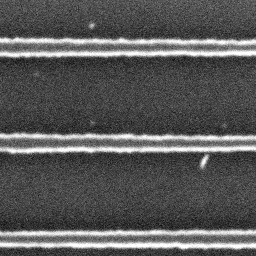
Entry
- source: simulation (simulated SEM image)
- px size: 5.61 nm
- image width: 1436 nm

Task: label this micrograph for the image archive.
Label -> lines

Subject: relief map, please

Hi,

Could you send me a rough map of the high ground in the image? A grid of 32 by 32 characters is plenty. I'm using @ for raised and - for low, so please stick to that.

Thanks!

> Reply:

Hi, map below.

--------------------------------
--------------------------------
--------------------------------
--------------------------------
--------------------------------
@@@@@@@@@@@@@@@@@@@@@@@@@@@@@@@@
@@@@@@@@@@@@@@@@@@@@@@@@@@@@@@@@
--------------------------------
--------------------------------
--------------------------------
--------------------------------
--------------------------------
--------------------------------
--------------------------------
--------------------------------
--------------------------------
--------------------------------
@@@@@@@@@@@@@@@@@@@@@@@@@@@@@@@@
@@@@@@@@@@@@@@@@@@@@@@@@@@@@@@@@
--------------------------------
--------------------------------
--------------------------------
--------------------------------
--------------------------------
--------------------------------
--------------------------------
--------------------------------
--------------------------------
--------------------------------
@@@@@@@@@@@@@@@@@@@@@@@@@@@@@@@@
@@@@@@@@@@@@@@@@@@@@@@@@@@@@@@@@
--------------------------------